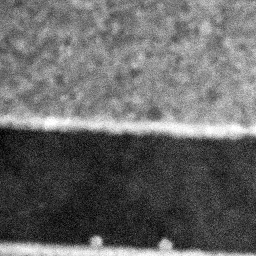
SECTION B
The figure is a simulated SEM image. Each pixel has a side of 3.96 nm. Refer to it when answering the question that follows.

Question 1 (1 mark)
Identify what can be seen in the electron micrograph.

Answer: one or a few lines or trenches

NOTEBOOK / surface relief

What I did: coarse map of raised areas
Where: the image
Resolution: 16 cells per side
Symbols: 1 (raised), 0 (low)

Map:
1111111111111111
1111111111111111
1111111111111111
1111111111111111
1111111111111111
1111111111111111
1111111111111111
0111111111111111
0000000000000000
0000000000000000
0000000000000000
0000000000000000
0000000000000000
0000000000000000
0000000000000000
0000000000000000